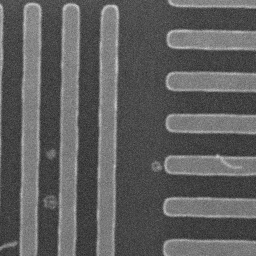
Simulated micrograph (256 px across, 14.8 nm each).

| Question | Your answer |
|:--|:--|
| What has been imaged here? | groups of lines, slits or small figures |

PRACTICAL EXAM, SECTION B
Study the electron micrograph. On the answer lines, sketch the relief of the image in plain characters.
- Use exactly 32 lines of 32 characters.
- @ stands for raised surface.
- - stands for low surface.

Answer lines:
---------------------@@@@@@@@@@@
---@@---@@---@@-----------------
---@@---@@---@@-----------------
---@@---@@---@@-----------------
---@@---@@---@@------@@@@@@@@@@@
---@@---@@---@@------@@@@@@@@@@@
---@@---@@---@@-----------------
---@@---@@---@@-----------------
---@@---@@---@@-----------------
---@@---@@---@@------@@@@@@@@@@@
---@@---@@---@-------@@@@@@@@@@@
---@@---@@---@------------------
---@@---@@---@------------------
---@@---@@--@@------------------
---@@---@@--@@-------@@@@@@@@@--
---@@---@@--@@-------@@@@@@@@@@@
---@@---@@--@@--------@@@@@@@@@@
---@@---@@--@@------------------
---@@---@@--@@------------------
---@@---@@--@@-------------@----
---@@---@@--@@-------@@@@@@@@@@@
---@@---@@--@@-------@@@@@@@@@@@
---@@---@@--@@------------------
---@@---@---@@------------------
---@@---@---@@------------------
---@@---@---@@-------@@@@@@@@@@@
---@@---@---@@-------@@@@@@@@@@@
---@@---@---@@------------------
---@@--@@---@@------------------
---@@--@@---@@------------------
---@@--@@---@@-------@@@@@@@@@@@
---@@--@@---@@-------@@@@@@@@@@@